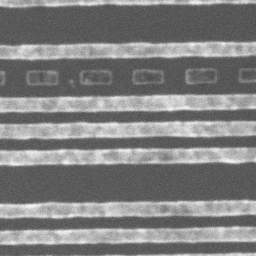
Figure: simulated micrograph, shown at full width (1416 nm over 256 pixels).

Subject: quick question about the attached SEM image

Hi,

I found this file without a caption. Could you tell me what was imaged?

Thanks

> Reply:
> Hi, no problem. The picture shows wiring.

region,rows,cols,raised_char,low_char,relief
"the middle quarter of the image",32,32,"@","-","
--------------------------------
-------------------------------@
----@@@@@@@@-----@@@@@@@@------@
----@@@@@@@@-----@@@@@@@@------@
----@@@@@@@@-----@@@@@@@-------@
--------------------------------
--------------------------------
--------------------------------
@@--@@@@@@@@@@@@@@@@@@@@@@@@@@@@
@@@@@@@@@@@@@@@@@@@@@@@@@@@@@@@@
@@@@@@@@@@@@@@@@@@@@@@@@@@@@@@@@
@@@@@@@@@@@@@@@@@@@@@@@@@@@-----
--------------------------------
--------------------------------
---------------------------@@---
@@@@@@@@@@@@@@@@@@@@@@@@@@@@@@@@
@@@@@@@@@@@@@@@@@@@@@@@@@@@@@@@@
@@@@@@@@@@@@@@@@@@@@@@@@@@@@@@@@
--------------------------------
--------------------------------
--------------------------------
----------------@@@@-@@@@@@@@@-@
@@@@@@@@@@@@@@@@@@@@@@@@@@@@@@@@
@@@@@@@@@@@@@@@@@@@@@@@@@@@@@@@@
@@@@@@@@@@@@@@@@@@@@@@@@@@@@----
--------------------------------
--------------------------------
--------------------------------
--------------------------------
--------------------------------
--------------------------------
--------------------------------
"